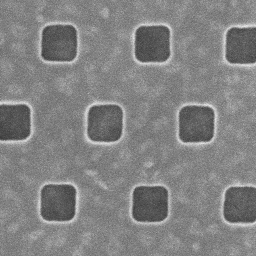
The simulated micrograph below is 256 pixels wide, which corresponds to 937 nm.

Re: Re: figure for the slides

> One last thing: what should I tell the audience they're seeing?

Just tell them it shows holes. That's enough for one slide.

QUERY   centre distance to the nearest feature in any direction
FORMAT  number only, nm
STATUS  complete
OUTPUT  335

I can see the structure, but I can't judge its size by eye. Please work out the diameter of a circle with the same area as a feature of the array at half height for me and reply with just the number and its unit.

146 nm